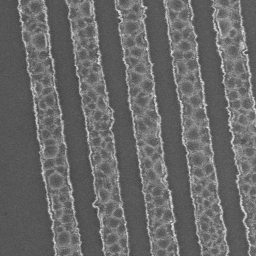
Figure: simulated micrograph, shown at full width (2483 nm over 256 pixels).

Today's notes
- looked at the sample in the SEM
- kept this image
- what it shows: parallel lines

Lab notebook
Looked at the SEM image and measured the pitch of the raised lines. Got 0.466 µm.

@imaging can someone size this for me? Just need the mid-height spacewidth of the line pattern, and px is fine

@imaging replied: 22.3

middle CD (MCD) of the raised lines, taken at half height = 24.7 px